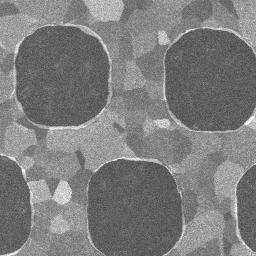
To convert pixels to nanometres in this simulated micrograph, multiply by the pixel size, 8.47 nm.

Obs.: holes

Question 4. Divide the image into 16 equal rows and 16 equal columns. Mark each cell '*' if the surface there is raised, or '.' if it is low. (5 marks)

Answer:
****************
****************
**....*****....*
*......***......
*......***......
*......***......
*......***......
**....*****....*
****************
****************
.*****....******
..****.....****.
..***......****.
..***......****.
..****.....****.
.*****.....*****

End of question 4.